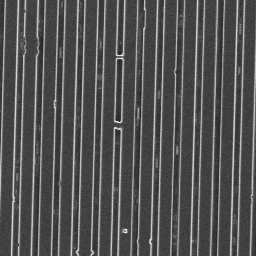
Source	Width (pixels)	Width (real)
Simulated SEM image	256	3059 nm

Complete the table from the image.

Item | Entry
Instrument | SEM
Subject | parallel lines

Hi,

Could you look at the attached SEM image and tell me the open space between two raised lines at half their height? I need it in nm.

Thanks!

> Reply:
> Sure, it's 70.2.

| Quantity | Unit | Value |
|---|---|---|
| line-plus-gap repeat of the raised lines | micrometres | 0.238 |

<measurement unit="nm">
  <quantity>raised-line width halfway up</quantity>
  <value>163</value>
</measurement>